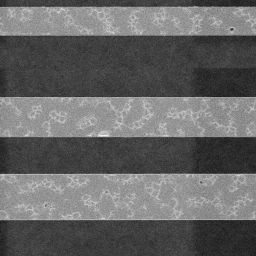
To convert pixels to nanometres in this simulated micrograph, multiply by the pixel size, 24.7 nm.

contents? one or a few lines or trenches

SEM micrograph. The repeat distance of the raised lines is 2.17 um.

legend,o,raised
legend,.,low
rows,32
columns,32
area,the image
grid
................................
oooooooooooooooooooooooooooooooo
oooooooooooooooooooooooooooooooo
oooooooooooooooooooooooo.ooooooo
................................
................................
................................
................................
................................
................................
................................
................................
oooooooooooooooooooooooooooooooo
oooooooooooooooooooooooooooooooo
oooooooooooooooooooooooooooooooo
oooooooooooooooooooooooooooooooo
oooooooooooooooooooooooooooooooo
................................
................................
................................
................................
................................
oooooooooooooooooooooooooooooooo
oooooooooooooooooooooooooooooooo
oooooooooooooooooooooooooooooooo
oooooooooooooooooooooooooooooooo
oooooooooooooooooooooooooooooooo
................................
................................
................................
................................
................................